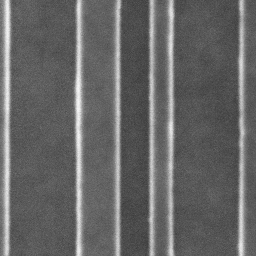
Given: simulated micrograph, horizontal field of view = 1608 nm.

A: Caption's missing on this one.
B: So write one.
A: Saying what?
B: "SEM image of lines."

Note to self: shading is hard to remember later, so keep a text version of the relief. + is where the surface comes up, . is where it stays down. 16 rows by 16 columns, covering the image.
.....++..++....+
.....++..++....+
.....++..++....+
.....++..++....+
.....++..++....+
.....++..++....+
.....++..++....+
.....++..++....+
.....++..++....+
.....++..++....+
.....++..++....+
.....++..++....+
.....++..++....+
.....++..++....+
.....++..++....+
.....++..++....+